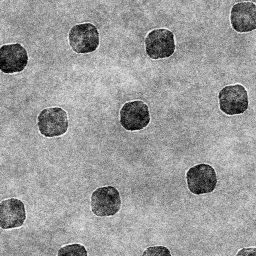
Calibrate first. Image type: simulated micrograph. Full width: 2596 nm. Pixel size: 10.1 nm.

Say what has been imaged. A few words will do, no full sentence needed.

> holes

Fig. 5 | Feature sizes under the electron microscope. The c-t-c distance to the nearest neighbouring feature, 831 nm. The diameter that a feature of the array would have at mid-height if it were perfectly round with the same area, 0.32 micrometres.